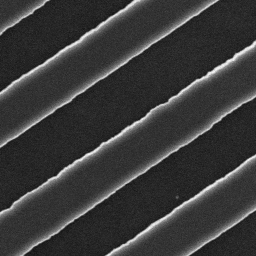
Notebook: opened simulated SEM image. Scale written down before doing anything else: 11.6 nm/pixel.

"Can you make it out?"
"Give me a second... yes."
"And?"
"lines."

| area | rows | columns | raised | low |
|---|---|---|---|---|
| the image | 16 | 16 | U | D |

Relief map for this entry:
UUDDDDDDUUUUUDDD
UDDDDDUUUUUDDDDD
DDDDDUUUUUDDDDDD
DDDUUUUUDDDDDDDU
DDUUUUUDDDDDDUUU
UUUUUUDDDDDDUUUU
UUUUDDDDDDUUUUUD
UUUDDDDDDUUUUUDD
UDDDDDDUUUUUDDDD
DDDDDDUUUUUDDDDD
DDDDUUUUUDDDDDDU
DDDUUUUUDDDDDUUU
DUUUUUDDDDDDUUUU
UUUUUDDDDDUUUUUD
UUUUDDDDDUUUUUDD
UUDDDDDUUUUUDDDD